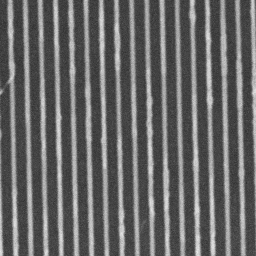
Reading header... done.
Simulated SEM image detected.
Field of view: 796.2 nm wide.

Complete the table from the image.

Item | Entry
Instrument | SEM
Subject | parallel lines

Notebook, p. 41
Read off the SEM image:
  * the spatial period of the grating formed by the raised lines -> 0.0471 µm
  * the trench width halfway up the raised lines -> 11.3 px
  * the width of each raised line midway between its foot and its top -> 0.0117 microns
